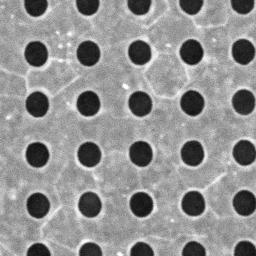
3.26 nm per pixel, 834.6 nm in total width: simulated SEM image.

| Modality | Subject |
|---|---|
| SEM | a regular array of holes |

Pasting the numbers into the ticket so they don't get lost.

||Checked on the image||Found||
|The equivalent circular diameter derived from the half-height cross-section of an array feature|0.082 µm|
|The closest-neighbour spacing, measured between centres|164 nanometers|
